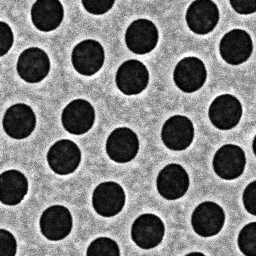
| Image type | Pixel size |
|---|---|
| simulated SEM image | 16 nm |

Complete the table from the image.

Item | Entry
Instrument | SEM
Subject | a regular array of holes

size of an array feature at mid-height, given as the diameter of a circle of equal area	572	nm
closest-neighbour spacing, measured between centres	809	nm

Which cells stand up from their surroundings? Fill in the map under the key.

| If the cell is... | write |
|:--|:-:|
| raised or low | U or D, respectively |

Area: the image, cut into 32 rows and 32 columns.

UUUUDDDDUUDDDDUUUUUUUUUUDDDUUDDD
UUUUDDDDUUUDDUUUUUUUUUUDDDDUUUDD
UUUUDDDDUUUUUUUUUDDUUUUDDDDUUUUU
DUUUDDDUUUUUUUUUDDDDUUUUDDDUUUUU
DDUUUUUUUUUUUUUUDDDDUUUUUUUUDDDU
DDUUUUUUUUDDDUUUDDDDUUUUUUUDDDDD
DUUDDDUUUDDDDUUUDDDUUUUUUUUDDDDD
UUDDDDUUUDDDDUUUDUUUUUUDDUUUDDDU
UUDDDDUUUDDDDUUDDDUUUUDDDDUUUUUU
UUDDDDUUUUUUUUDDDDDUUUDDDDUUUUUU
UUUUUUUUUUUUUUDDDDDUUUDDDDUUUUUU
UUUUUUUUUUUUUUUDDDUUUUUDUUUUUUUU
UUUUUUUUUDDUUUUUUUUUUUUUUUUDDDUU
UDDDUUUUDDDDUUUUUUUUUUUUUUDDDDUU
DDDDUUUUDDDDUUUUUUUUUUDUUUDDDDUU
DDDDDUUUDDDDUUUUUUUUDDDDUUUDDDUU
UDDDUUUUDDDUUUDDDUUUDDDDUUUUUUUU
UUUUUUUDDUUUUDDDDUUUDDDDUUUUUUUU
UUUUUUDDDDUUUDDDDUUUUDDUUUUDDDUU
UUUUUUDDDDUUUDDDDUUUUUUUUUUDDDDU
UUUUUUDDDDUUUUUUUUUUUDUUUUUDDDDU
DDDUUUUDDUUUUUUUUUUUDDDUUUUDDDUU
DDDUUUUUUUUUUUUUUUUUDDDDUUUUDUUU
DDDDUUUUUUUUDDDUUUUUDDDDUUUUUUUD
DDDUUUUUUUUDDDDDUUUUDDDUUUUUUUDD
DDUUUUUUUUUDDDDDUUUUUUUUUDDUUUDD
UUUUUDDDDUUUDDDUUUUUUUUUDDDDUUUD
UUUUUDDDDUUUUUUUUDDDUUUUDDDDUUUU
UUUUUDDDDUUUUUUUDDDDDUUUDDDDUUDD
DDUUUDDDUUUUUUUUDDDDDUUUUDDUUUDD
DDUUUUUUUUUDDDDUUDDDUUUUUUUUUUDD
DDUUUUUUUUUDDDDUUUUUUUUUDUUUUUDD